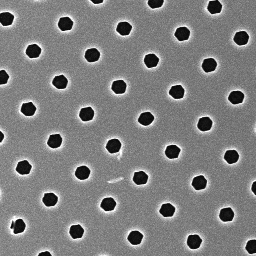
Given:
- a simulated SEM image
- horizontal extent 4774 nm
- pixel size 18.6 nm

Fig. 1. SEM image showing a regular array of holes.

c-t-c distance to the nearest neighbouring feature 768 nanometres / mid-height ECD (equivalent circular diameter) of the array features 281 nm